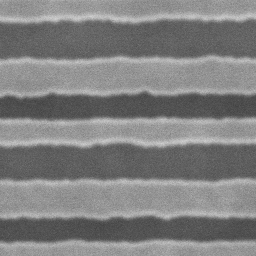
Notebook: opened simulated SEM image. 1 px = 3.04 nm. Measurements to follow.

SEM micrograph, lines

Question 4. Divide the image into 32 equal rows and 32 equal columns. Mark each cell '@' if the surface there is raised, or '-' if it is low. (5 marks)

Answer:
@@@@@@@@@@@@@@@@@@@@@@@@@@@@@@@@
@@@@@@@@@@@@@@@@@@@@@@@@@@@@@@@@
-@@@@----------@@@--------------
--------------------------------
--------------------------------
--------------------------------
--------------------------------
--@@--------@@@@@@@@@@-@@@@@@@@@
@@@@@@@@@@@@@@@@@@@@@@@@@@@@@@@@
@@@@@@@@@@@@@@@@@@@@@@@@@@@@@@@@
@@@@@@@@@@@@@@@@@@@@@@@@@@@@@@@@
@@@@@@@@@@@@@@@@@--@@@@@@@@@@@@@
--------------------------------
--------------------------------
--------------------------------
@@@@@@@@@@@@@@@@@@@@@@@@@@@@@@@@
@@@@@@@@@@@@@@@@@@@@@@@@@@@@@@@@
@@@@@@@@@@@@@@@@@@@@@@@@@@@@@@@@
--------------------------------
--------------------------------
--------------------------------
--------------------------------
---------------@-------------@@-
@@@@@@@@@@@@@@@@@@@@@@@@@@@@@@@@
@@@@@@@@@@@@@@@@@@@@@@@@@@@@@@@@
@@@@@@@@@@@@@@@@@@@@@@@@@@@@@@@@
@@@@@@@@@@@@@@@@@@@@@@@@@@@@@@@@
--------------------------------
--------------------------------
--------------------------------
@@@@@@@@@@@@@@@@@@@@@@@@@@@@@@@@
@@@@@@@@@@@@@@@@@@@@@@@@@@@@@@@@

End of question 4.